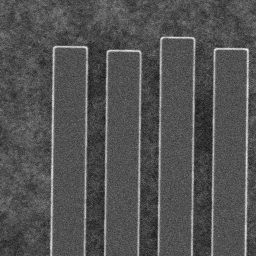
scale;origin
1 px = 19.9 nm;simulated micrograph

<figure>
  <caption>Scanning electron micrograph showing groups of lines, slits or small figures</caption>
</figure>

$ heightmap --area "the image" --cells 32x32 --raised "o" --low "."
................................
................................
................................
................................
................................
....................oooo........
.......oooo...ooo...oooo...oooo.
.......oooo..ooooo..oooo...oooo.
.......oooo..ooooo..oooo...oooo.
.......oooo..oooo...oooo...oooo.
.......oooo..oooo...oooo...oooo.
.......oooo..oooo...oooo...oooo.
.......oooo..oooo...oooo...oooo.
.......oooo..oooo...oooo...oooo.
.......oooo..oooo...oooo...oooo.
.......oooo..oooo...oooo...oooo.
.......oooo..oooo...oooo...oooo.
.......oooo..oooo...oooo...oooo.
.......oooo..oooo...oooo...oooo.
.......oooo..oooo...oooo...oooo.
.......oooo..oooo...oooo...oooo.
.......oooo..oooo...oooo...oooo.
.......oooo..oooo...oooo...oooo.
.......oooo..oooo...oooo...oooo.
.......oooo..oooo...oooo...oooo.
.......oooo..oooo...oooo...oooo.
.......oooo..oooo...oooo...oooo.
.......oooo..oooo...oooo...oooo.
......ooooo..oooo...oooo...oooo.
......ooooo..oooo...oooo...oooo.
......ooooo..oooo...oooo...oooo.
......ooooo..oooo...oooo..ooooo.